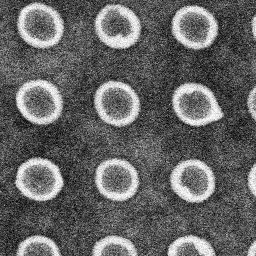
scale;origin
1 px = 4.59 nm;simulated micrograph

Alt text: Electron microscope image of a regular array of raised bodies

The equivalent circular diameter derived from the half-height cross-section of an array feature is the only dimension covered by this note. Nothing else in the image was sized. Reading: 196 nm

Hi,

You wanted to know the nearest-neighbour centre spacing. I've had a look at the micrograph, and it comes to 352 nm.